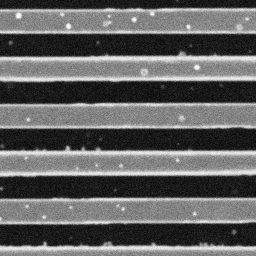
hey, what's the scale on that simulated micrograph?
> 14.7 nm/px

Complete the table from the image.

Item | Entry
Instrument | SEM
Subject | lines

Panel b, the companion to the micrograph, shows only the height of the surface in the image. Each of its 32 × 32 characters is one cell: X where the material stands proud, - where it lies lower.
--------------------------------
XXXXXXXXXXXXXXXXXXXXXXXXXXXXXXXX
XXXXXXXXXXXXXXXXXXXXXXXXXXXXXXXX
XXXXXXXXXXXXXXXXXXXXXXXXXXXXXXXX
--------------------------------
--------------------------------
--------------------------------
XXXXXXXXXXXXXXXXXXXXXXXXXXXXXXXX
XXXXXXXXXXXXXXXXXXXXXXXXXXXXXXXX
XXXXXXXXXXXXXXXXXXXXXXXXXXXXXXXX
--------------------------------
--------------------------------
--------------------------------
XXXXXXXXXXXXXXXXXXXXXXXXXXXXXXXX
XXXXXXXXXXXXXXXXXXXXXXXXXXXXXXXX
XXXXXXXXXXXXXXXXXXXXXXXXXXXXXXXX
--------------------------------
--------------------------------
--------------------------------
XXXXXXXXXXXXXXXXXXXXXXXXXXXXXXXX
XXXXXXXXXXXXXXXXXXXXXXXXXXXXXXXX
XXXXXXXXXXXXXXXXXXXXXXXXXXXXXXXX
--------------------------------
--------------------------------
--------------------------------
XXXXXXXXXXXXXXXXXXXXXXXXXXXXXXXX
XXXXXXXXXXXXXXXXXXXXXXXXXXXXXXXX
XXXXXXXXXXXXXXXXXXXXXXXXXXXXXXXX
--------------------------------
--------------------------------
--------------------------------
XXXXXXXXXXXXXXXXXXXXXXXXXXXXXXXX